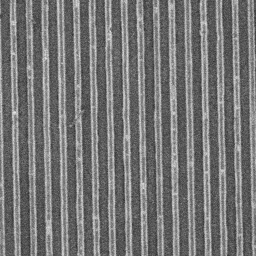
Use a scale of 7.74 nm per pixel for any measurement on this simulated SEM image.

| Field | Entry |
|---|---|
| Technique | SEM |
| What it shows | parallel lines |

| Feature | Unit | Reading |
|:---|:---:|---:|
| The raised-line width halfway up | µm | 0.0377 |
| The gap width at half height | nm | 82.2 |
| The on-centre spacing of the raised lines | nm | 123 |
